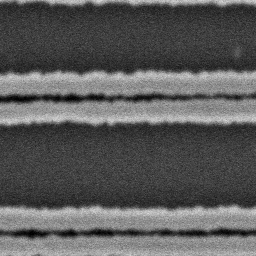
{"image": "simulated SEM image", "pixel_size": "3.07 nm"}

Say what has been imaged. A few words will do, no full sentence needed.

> lines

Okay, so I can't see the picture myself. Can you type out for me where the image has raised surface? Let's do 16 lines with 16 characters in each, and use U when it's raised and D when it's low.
DDDDDDDDDDDDDDDD
DDDDDDDDDDDDDDDD
DDDDDDDDDDDDDDDD
DDDDDDDDDDDDDDDD
DDDDDDDDDDDDDDDD
UUUUUUUUUUUUUUUU
UUUUUUUUUUUUUUUU
UUUUUUUUUUUUUUUU
DDDDDDDDDDDDDDDD
DDDDDDDDDDDDDDDD
DDDDDDDDDDDDDDDD
DDDDDDDDDDDDDDDD
DDDDDDDDDDDDDDDD
UUUUUUUUUUUUUUUU
UUUUUUUUUUUUUUUU
UUUUUUUUUUUUUUUU